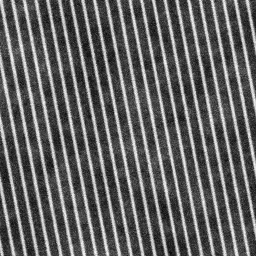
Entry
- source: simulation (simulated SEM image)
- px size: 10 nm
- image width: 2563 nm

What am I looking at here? parallel lines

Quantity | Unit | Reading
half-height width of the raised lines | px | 2.46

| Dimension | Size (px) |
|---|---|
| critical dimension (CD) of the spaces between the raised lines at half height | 9.09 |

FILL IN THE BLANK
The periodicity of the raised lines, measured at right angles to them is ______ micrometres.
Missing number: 0.115